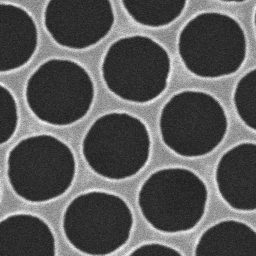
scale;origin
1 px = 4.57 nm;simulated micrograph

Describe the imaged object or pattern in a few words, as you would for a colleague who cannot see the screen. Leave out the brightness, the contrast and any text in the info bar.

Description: holes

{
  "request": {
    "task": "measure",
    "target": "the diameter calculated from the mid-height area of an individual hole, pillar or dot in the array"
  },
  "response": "307 nm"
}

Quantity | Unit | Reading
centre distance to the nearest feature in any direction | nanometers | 358